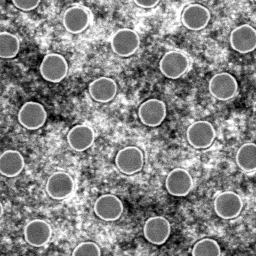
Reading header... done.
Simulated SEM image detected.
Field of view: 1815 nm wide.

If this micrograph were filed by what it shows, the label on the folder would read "a regular array of raised bodies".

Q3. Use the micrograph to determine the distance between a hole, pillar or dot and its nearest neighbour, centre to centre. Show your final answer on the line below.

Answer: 52.3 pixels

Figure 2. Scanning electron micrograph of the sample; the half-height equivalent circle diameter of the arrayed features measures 187 nanometres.